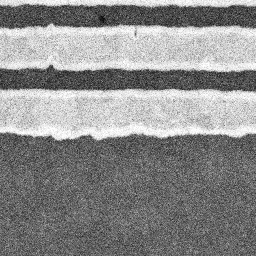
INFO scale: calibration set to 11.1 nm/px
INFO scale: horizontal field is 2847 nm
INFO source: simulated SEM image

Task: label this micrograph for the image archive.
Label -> one or a few lines or trenches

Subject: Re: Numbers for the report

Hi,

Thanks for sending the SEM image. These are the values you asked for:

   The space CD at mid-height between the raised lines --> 312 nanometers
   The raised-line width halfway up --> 397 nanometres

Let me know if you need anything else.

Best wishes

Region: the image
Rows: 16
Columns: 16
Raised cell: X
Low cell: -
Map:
----------------
----------------
XXXXXXXXXXXXXXXX
XXXXXXXXXXXXXXXX
----------------
----------------
XXXXXXXXXXXXXXXX
XXXXXXXXXXXXXXXX
----------------
----------------
----------------
----------------
----------------
----------------
----------------
----------------